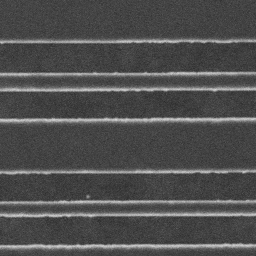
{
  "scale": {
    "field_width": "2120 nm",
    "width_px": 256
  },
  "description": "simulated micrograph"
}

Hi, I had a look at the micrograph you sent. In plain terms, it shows lines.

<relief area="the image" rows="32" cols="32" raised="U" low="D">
UUUUUUUUUUUUUUUUUUUUUUUUUUUUUUUU
UUUUUUUUUUUUUUUUUUUUUUUUUUUUUUUU
UUUUUUUUUUUUUUUUUUUUUUUUUUUUUUUU
UUUUUUUUUUUUUUUUUUUUUUUUUUUUUUUU
UUUUUUUUUUUUUUUUUUUUUUUUUUUUUUUU
DDDDDDDDDDDDDDDDDDDDDDDDDDDDDDDD
DDDDDDDDDDDDDDDDDDDDDDDDDDDDDDDD
DDDDDDDDDDDDDDDDDDDDDDDDDDDDDDDD
DDDDDDDDDDDDDDDDDDDDDDDDDDDDDDDD
UUUUUUUUUUUUUUUUUUUUUUUUUUUUUUUU
UUUUUUUUUUUUUUUUUUUUUUUUUUUUUUUU
DDDDDDDDDDDDDDDDDDDDDDDDDDDDDDDD
DDDDDDDDDDDDDDDDDDDDDDDDDDDDDDDD
DDDDDDDDDDDDDDDDDDDDDDDDDDDDDDDD
DDDDDDDDDDDDDDDDDDDDDDDDDDDDDDDD
UUUUUUUUUUUUUUUUUUUUUUUUUUUUUUUU
UUUUUUUUUUUUUUUUUUUUUUUUUUUUUUUU
UUUUUUUUUUUUUUUUUUUUUUUUUUUUUUUU
UUUUUUUUUUUUUUUUUUUUUUUUUUUUUUUU
UUUUUUUUUUUUUUUUUUUUUUUUUUUUUUUU
UUUUUUUUUUUUUUUUUUUUUUUUUUUUUUUU
UUUUUUUUUUUUUUUUUUUUUUUUUUUUUDUD
DDDDDDDDDDDDDDDDDDDDDDDDDDDDDDDD
DDDDDDDDDDDDDDDDDDDDDDDDDDDDDDDD
DDDDDDDDDDDDDDDDDDDDDDDDDDDDDDDD
UUUUUUUUUUUUUUUUUUUUUUUUUUUUUUUU
UUUUUUUUUUUUUUUUUUUUUUUUUUUUUUUU
DDDDDDDDDDDDDDDDDDDDDDDDDDDDDDDD
DDDDDDDDDDDDDDDDDDDDDDDDDDDDDDDD
DDDDDDDDDDDDDDDDDDDDDDDDDDDDDDDD
DDDDDDDDDDDDDDDDDDDDDDDDDDDDDDDD
UUUUUUUUUUUUUUUUUUUUUUUUUUUUUUUU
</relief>